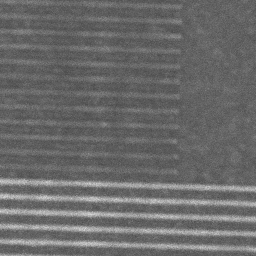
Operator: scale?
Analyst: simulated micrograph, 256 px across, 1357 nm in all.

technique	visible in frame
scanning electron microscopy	parallel lines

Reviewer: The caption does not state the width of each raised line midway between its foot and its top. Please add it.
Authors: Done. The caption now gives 0.0212 µm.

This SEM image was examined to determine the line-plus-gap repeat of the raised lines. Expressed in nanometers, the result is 79.7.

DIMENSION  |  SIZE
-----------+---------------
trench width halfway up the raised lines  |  0.057 um